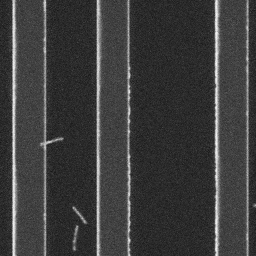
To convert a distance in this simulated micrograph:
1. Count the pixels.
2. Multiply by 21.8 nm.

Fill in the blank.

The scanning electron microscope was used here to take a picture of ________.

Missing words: lines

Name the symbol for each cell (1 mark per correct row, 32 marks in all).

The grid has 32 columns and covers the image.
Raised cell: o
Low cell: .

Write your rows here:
..oooo......oooo...........oooo.
..oooo......oooo...........oooo.
..oooo......oooo...........oooo.
..oooo......oooo...........oooo.
..oooo......oooo...........oooo.
..oooo......oooo...........oooo.
..oooo......oooo...........oooo.
..oooo......oooo...........oooo.
..oooo......oooo...........oooo.
..oooo......oooo...........oooo.
..oooo......oooo...........oooo.
..oooo......oooo...........oooo.
..oooo......oooo...........oooo.
..oooo......oooo...........oooo.
..oooo......oooo...........oooo.
..oooo......oooo...........oooo.
..oooo......oooo...........oooo.
..oooo......oooo...........oooo.
..oooo......oooo...........oooo.
..oooo......oooo...........oooo.
..oooo......oooo...........oooo.
..oooo......oooo...........oooo.
..oooo......oooo...........oooo.
..oooo......oooo...........oooo.
..oooo......oooo...........oooo.
..oooo......oooo...........oooo.
..oooo......oooo...........oooo.
..oooo......oooo...........oooo.
..oooo......oooo...........oooo.
..oooo......oooo...........oooo.
..oooo......oooo...........oooo.
..oooo......oooo...........oooo.